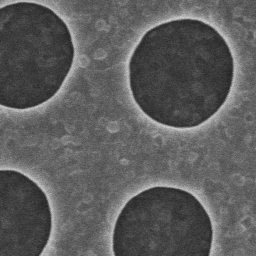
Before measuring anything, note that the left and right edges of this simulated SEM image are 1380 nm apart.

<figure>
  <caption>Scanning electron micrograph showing holes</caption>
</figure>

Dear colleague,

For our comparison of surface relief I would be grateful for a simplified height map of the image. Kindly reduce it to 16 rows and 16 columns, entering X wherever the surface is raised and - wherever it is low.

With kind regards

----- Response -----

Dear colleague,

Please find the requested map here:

---XXXXXXXXXXXXX
----XXXXXX---XXX
----XXXXX-----XX
-----XXX------XX
----XXXX-------X
----XXXX------XX
---XXXXXX-----XX
XXXXXXXXXX---XXX
XXXXXXXXXXXXXXXX
XXXXXXXXXXXXXXXX
XXXXXXXXXXXXXXXX
--XXXXXXXXXXXXXX
---XXXXX----XXXX
---XXXX------XXX
---XXXX------XXX
---XXXX------XXX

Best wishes